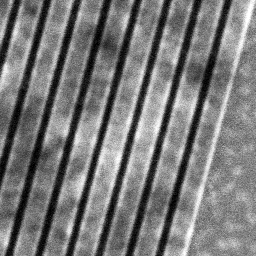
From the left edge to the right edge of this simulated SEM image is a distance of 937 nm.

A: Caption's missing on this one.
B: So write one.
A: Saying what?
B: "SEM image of parallel lines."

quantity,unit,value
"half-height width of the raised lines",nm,74.3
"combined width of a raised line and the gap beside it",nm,106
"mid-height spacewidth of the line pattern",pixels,8.8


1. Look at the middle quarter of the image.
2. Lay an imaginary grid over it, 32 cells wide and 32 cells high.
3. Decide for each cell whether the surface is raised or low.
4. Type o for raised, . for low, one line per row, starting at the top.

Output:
ooooo...ooooo..ooooo...ooooo..oo
ooooo..oooooo..ooooo..oooooo..oo
ooooo..ooooo...ooooo..ooooo...oo
ooooo..ooooo..oooooo..ooooo..ooo
oooo...ooooo..ooooo...ooooo..ooo
oooo..ooooo...ooooo..oooooo..ooo
oooo..ooooo...ooooo..ooooo...ooo
ooo...ooooo..ooooo...ooooo..oooo
ooo..oooooo..ooooo...ooooo..oooo
ooo..ooooo...ooooo..ooooo...oooo
ooo..ooooo..oooooo..ooooo..ooooo
oo...ooooo..ooooo...ooooo..ooooo
oo..oooooo..ooooo..oooooo..ooooo
oo..ooooo...ooooo..ooooo...ooooo
oo..ooooo..oooooo..ooooo..oooooo
o...ooooo..ooooo...ooooo..ooooo.
o..oooooo..ooooo..oooooo..ooooo.
o..ooooo...ooooo..ooooo...ooooo.
...ooooo..ooooo...ooooo..oooooo.
...ooooo..ooooo...ooooo..ooooo..
..ooooo...ooooo..ooooo...ooooo..
..ooooo..oooooo..ooooo...ooooo..
..ooooo..ooooo...ooooo..ooooo...
.oooooo..ooooo..oooooo..ooooo...
.ooooo...ooooo..ooooo...ooooo..o
.ooooo..oooooo..ooooo..oooooo..o
.ooooo..ooooo...ooooo..ooooo...o
oooooo..ooooo..oooooo..ooooo..oo
ooooo...ooooo..ooooo...ooooo..oo
ooooo..oooooo..ooooo..oooooo..oo
ooooo..ooooo...ooooo..ooooo...oo
oooo...ooooo..oooooo..ooooo..ooo